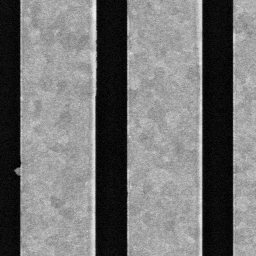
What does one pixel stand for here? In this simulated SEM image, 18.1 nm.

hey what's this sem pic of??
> lines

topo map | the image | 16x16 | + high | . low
.+++++..+++++..+
.+++++..+++++..+
.+++++..+++++..+
.+++++..+++++..+
.+++++..+++++..+
.+++++..+++++..+
.+++++..+++++..+
.+++++..+++++..+
.+++++..+++++..+
.+++++..+++++..+
.+++++..+++++..+
.+++++..+++++..+
.+++++..+++++..+
.+++++..+++++..+
.+++++..+++++..+
.+++++..+++++..+